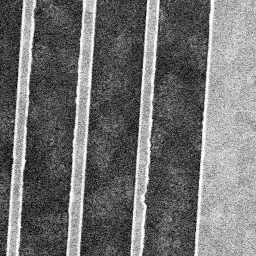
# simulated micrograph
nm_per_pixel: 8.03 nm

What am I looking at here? one or a few lines or trenches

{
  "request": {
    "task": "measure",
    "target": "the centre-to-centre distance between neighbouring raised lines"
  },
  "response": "497 nanometers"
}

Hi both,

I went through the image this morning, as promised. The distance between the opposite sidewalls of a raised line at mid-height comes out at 86.1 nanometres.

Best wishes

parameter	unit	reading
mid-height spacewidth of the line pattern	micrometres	0.425